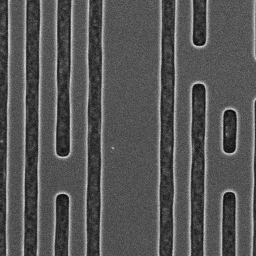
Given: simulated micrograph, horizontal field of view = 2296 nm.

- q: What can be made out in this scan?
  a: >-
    groups of lines, slits or small figures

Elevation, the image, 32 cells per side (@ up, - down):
-@@--@@--@@--@@@@@@@--@@--@@@@@@
-@@--@@--@@--@@@@@@@--@@--@@@@@@
-@@--@@--@@--@@@@@@@--@@--@@@@@@
-@@--@@--@@--@@@@@@@--@@--@@@@@@
-@@--@@--@@--@@@@@@@--@@--@@@@@@
-@@--@@--@@--@@@@@@@--@@--@@@@@@
-@@--@@--@@--@@@@@@@--@@@@@@@@@@
-@@--@@--@@--@@@@@@@--@@@@@@@@@@
-@@--@@--@@--@@@@@@@--@@@@@@@@@@
-@@--@@--@@--@@@@@@@--@@@@@@@@@@
-@@--@@--@@--@@@@@@@--@@@@@@@@@@
-@@--@@--@@--@@@@@@@--@@--@@@@@@
-@@--@@--@@--@@@@@@@--@@--@@@@@@
-@@--@@--@@--@@@@@@@--@@--@@@@@@
-@@--@@--@@--@@@@@@@--@@--@@--@@
-@@--@@--@@--@@@@@@@--@@--@@--@@
-@@--@@--@@--@@@@@@@--@@--@@--@@
-@@--@@--@@--@@@@@@@--@@--@@--@@
-@@--@@--@@--@@@@@@@--@@--@@-@@@
-@@--@@@@@@--@@@@@@@--@@--@@@@@@
-@@--@@@@@@--@@@@@@@--@@--@@@@@@
-@@--@@@@@@--@@@@@@@--@@--@@@@@@
-@@--@@@@@@--@@@@@@@--@@--@@@@@@
-@@--@@@@@@--@@@@@@@--@@--@@@@@@
-@@--@@-@@@--@@@@@@@--@@--@@-@@@
-@@--@@--@@--@@@@@@@--@@--@@--@@
-@@--@@--@@--@@@@@@@--@@--@@--@@
-@@--@@--@@--@@@@@@@--@@--@@--@@
-@@--@@--@@--@@@@@@@--@@--@@--@@
-@@--@@--@@--@@@@@@@--@@--@@--@@
-@@--@@--@@--@@@@@@@--@@--@@--@@
-@@--@@--@@--@@@@@@@--@@--@@--@@